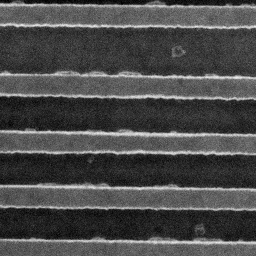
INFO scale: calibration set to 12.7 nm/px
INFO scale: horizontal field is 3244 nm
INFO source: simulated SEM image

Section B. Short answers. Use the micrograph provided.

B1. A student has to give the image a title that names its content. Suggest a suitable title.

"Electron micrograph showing lines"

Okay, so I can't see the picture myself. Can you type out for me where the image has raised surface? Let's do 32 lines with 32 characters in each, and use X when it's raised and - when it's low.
XX------------------------------
XXXXXXXXXXXXXXXXXXXXXXXXXXXXXXXX
XXXXXXXXXXXXXXXXXXXXXXXXXXXXXXXX
--------------------------XXXX--
--------------------------------
--------------------------------
--------------------------------
--------------------------------
--------------------------------
XXXXXXXXXXXXXXXX----------------
XXXXXXXXXXXXXXXXXXXXXXXXXXXXXXXX
XXXXXXXXXXXXXXXXXXXXXXXXXXXXXXXX
--------------------------------
--------------------------------
--------------------------------
--------------------------------
XXXXXXXXXXX---------------------
XXXXXXXXXXXXXXXXXXXXXXXXXXXXXXXX
XXXXXXXXXXXXXXXXXXXXXXXXXXXXXXXX
--------------------------------
--------------------------------
--------------------------------
--------------------------------
XXXXXXXXXXXXXXXXXXXXX-----------
XXXXXXXXXXXXXXXXXXXXXXXXXXXXXXXX
XXXXXXXXXXXXXXXXXXXXXXXXXXXXXXXX
--------------------------------
--------------------------------
--------------------------------
--------------------------------
XXXXXXXXXXXXXXXXXXXXXXXXXXXXXXXX
XXXXXXXXXXXXXXXXXXXXXXXXXXXXXXXX